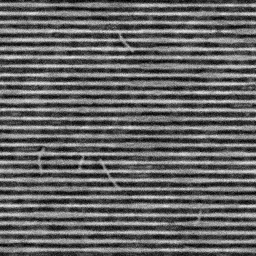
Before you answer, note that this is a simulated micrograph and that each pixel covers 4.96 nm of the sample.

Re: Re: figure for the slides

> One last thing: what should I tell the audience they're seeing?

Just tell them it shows parallel lines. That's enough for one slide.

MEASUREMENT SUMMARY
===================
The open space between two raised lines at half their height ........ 27.9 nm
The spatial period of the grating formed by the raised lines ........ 43.4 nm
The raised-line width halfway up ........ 13.6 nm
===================